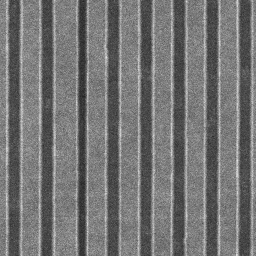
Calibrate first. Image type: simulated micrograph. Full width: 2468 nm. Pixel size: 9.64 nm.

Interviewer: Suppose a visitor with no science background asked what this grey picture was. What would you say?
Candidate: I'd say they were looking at parallel lines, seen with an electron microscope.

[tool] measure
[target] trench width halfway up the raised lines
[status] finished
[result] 124 nanometres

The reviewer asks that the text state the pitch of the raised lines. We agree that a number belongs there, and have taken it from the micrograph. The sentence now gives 0.318 um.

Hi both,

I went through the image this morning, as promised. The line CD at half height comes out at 0.192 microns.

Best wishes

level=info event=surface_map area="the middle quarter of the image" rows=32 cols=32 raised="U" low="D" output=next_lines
UUUDDDUUUUUDDDUUUUUDDDUUUUUDDDDU
UUUDDDUUUUUDDDUUUUUDDDUUUUUDDDDU
UUUDDDUUUUDDDDUUUUUDDDUUUUUDDDDU
UUUDDDUUUUDDDDUUUUUDDDUUUUUDDDDU
UUUDDDUUUUUDDDUUUUUDDDUUUUUDDDDU
UUUDDDUUUUUDDDUUUUUDDDUUUUUDDDDU
UUUDDDUUUUUDDDUUUUUDDDUUUUUDDDDU
UUUDDDUUUUDDDDUUUUUDDDUUUUUDDDDU
UUUDDDUUUUUDDDUUUUUDDDUUUUUDDDDU
UUUDDDUUUUUDDDUUUUUDDDUUUUUDDDDU
UUUDDDUUUUDDDDUUUUUDDDUUUUUDDDDU
UUUDDDUUUUDDDDUUUUUDDDUUUUUDDDDU
UUUDDDUUUUDDDDUUUUUDDDUUUUUDDDDU
UUUDDDUUUUUDDDUUUUUDDDUUUUUDDDDU
UUUDDDUUUUUDDDUUUUUDDDUUUUUDDDDU
UUUDDDUUUUUDDDUUUUUDDDUUUUUDDDDU
UUUDDDUUUUUDDDUUUUUDDDUUUUUDDDDU
UUUDDDUUUUUDDDUUUUUDDDUUUUUDDDDU
UUUDDDUUUUUDDDUUUUUDDDUUUUUDDDDU
UUUDDDUUUUUDDDUUUUUDDDUUUUUDDDDU
UUUDDDUUUUUDDDUUUUUDDDUUUUUDDDDU
UUUDDDUUUUUDDDUUUUUDDDUUUUUDDDDU
UUUDDDUUUUUDDDUUUUUDDDUUUUUDDDDU
UUUDDDUUUUUDDDUUUUUDDDUUUUUDDDDU
UUUDDDUUUUDDDDUUUUUDDDUUUUUDDDDU
UUUDDDUUUUDDDDUUUUUDDDUUUUUDDDDU
UUUDDDUUUUDDDDUUUUUDDDUUUUUDDDDU
UUUDDDUUUUDDDDUUUUUDDDUUUUUDDDUU
UUUDDDUUUUDDDDUUUUUDDDUUUUUDDDUU
UUUDDDUUUUDDDDUUUUUDDDUUUUUDDDUU
UUUDDDUUUUUDDDUUUUUDDDUUUUUDDDUU
UUUDDDUUUUUDDDUUUUUDDDUUUUUDDDUU